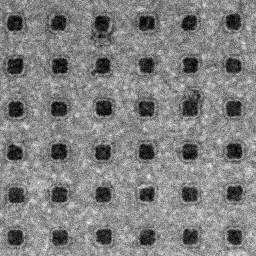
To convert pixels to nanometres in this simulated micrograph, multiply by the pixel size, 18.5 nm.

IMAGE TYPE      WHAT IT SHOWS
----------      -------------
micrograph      a regular array of raised bodies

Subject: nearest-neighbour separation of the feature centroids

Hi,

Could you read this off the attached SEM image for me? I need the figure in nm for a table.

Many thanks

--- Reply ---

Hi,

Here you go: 785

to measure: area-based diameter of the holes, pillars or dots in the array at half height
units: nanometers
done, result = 358